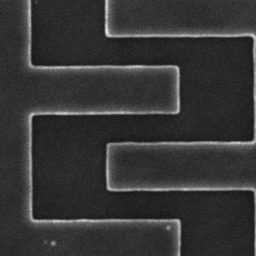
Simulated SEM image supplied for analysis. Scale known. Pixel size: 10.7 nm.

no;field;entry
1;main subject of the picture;groups of lines, slits or small figures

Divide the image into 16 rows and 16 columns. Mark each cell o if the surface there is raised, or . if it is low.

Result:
oo.....ooooooooo
oo.....ooooooooo
oo..............
oo..............
ooooooooooo.....
ooooooooooo.....
ooooooooooo.....
oo..............
oo..............
oo.....ooooooooo
oo.....ooooooooo
oo.....ooooooooo
oo..............
oo..............
ooooooooooo.....
ooooooooooo.....